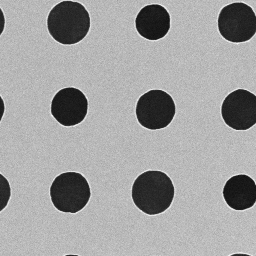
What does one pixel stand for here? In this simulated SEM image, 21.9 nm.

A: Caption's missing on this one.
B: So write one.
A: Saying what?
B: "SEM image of holes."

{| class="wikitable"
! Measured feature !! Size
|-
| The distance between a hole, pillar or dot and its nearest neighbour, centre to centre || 1.83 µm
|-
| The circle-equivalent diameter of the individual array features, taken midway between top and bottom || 887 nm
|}